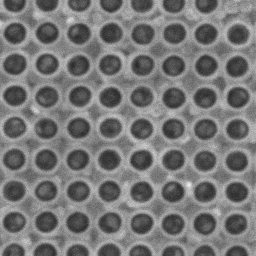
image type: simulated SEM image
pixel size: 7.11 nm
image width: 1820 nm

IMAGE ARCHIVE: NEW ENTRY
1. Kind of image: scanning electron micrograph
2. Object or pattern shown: a regular array of holes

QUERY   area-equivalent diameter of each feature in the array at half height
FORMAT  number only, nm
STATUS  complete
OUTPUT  168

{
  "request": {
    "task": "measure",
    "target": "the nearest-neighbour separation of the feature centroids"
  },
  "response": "222 nm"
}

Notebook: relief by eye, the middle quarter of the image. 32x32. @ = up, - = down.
-------@-------@-------@-------@
@-----@@@-----@@@-----@@------@@
@-----@@@@---@@@@@---@@@@----@@@
@@@@@@@@@@@@@@@@@@@@@@@@@@@@@@@@
@@@@@@@@@@@@@@@@@@@@@@@@@@@@@@@@
@@@--@@@@@@-@@@@@@@-@@@@@@@@@@@@
@@-----@@-----@@@-----@@@----@@@
@------@@-----@@@-----@@@-----@@
@------@@------@-------@-------@
@------@@-----@@@-----@@@-----@@
@@----@@@@----@@@@---@@@@-----@@
@@@@@@@@@@@@@@@@@@@@@@@@@@@@@@@@
@@@@@@@@@@@@@@@@@@@@@@@@@@@@@@@@
@@---@@@@@@--@@@@@@-@@@@@@@-@@@@
@-----@@@-----@@@-----@@@-----@@
@------@@------@@-----@@@-----@@
@------@@------@-------@------@@
@-----@@@-----@@@-----@@@-----@@
@@---@@@@@---@@@@@---@@@@@---@@@
@@@@@@@@@@@@@@@@@@@@@@@@@@@@@@@@
@@@@@@@@@@@@@@@@@@@@@@@@@@@@@@@@
@@---@@@@@---@@@@@@--@@@@@---@@@
@-----@@@-----@@@-----@@@-----@@
@------@-------@-------@-------@
-------@-------@-------@-------@
@-----@@------@@@-----@@@-----@@
@@---@@@@@---@@@@@---@@@@@---@@@
@@@@@@@@@@@@@@@@@@@@@@@@@@@@@@@@
@@@@@@@@@@@@@@@@@@@@@@@@@@@@@@@@
@@----@@@----@@@@@---@@@@@---@@@
@-----@@@-----@@@-----@@@-----@@
-------@------@@------@@------@@